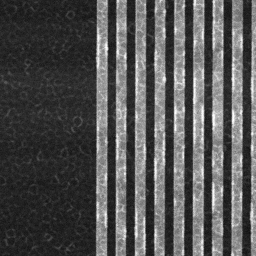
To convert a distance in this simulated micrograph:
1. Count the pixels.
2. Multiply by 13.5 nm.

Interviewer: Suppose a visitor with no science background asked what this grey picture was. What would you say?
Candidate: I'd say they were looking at parallel lines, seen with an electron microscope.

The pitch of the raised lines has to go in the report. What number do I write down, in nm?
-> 260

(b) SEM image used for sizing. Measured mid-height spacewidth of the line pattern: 126 nanometers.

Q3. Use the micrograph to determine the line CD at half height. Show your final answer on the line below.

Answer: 0.131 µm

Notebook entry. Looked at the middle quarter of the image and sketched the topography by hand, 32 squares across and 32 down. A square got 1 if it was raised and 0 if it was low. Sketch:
00000000111001110011000110001100
00000000111001110011000110001100
00000000111001100011000110001100
00000000111001100011000110001100
00000000111001100011000110001100
00000000111001100011000110001100
00000000111001100011000110001100
00000000111001100011000110001100
00000000111001100011000110001100
00000000111001100011000110001100
00000000111001100011000110001100
00000000111001110011000110001100
00000000111001100011000110001100
00000000111001100011000110001100
00010000111001100011000110001100
00000000111001100011000110001100
00000000111001100011000110001100
00000000111001100011000110001100
00000000111001100011000110001100
00000000111001100011000110001100
00000000111001100011000110001100
00000000111001100011000110001100
00000000111001100011000110001100
00000000111001100011000110001100
00000000111001100011000110001100
00000000111001100011000110001100
00000000111001100011000110001100
00000000111001100011000110001100
00000000111001100011000110001100
00000000111001100011000110001100
00000000111001100011000110001100
00000000111001100011000110001100